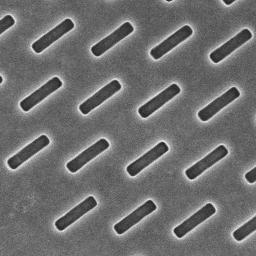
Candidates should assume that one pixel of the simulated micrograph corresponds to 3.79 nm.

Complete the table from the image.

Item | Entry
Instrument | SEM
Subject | a regular array of holes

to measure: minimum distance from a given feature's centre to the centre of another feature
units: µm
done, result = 0.224